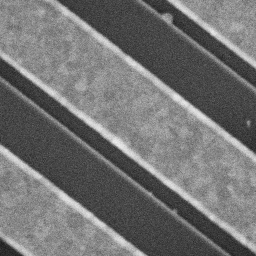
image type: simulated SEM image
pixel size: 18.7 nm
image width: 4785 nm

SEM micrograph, lines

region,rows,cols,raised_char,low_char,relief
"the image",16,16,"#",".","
####.......#####
#####.......####
#######.......##
########.......#
.########.......
...########.....
....########....
.....########...
.......#######..
#.......########
##.......#######
###.......######
####........####
######.......###
#######.......##
.#######........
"